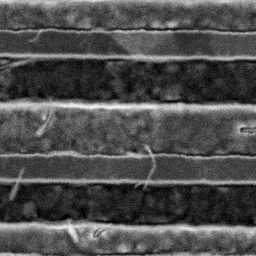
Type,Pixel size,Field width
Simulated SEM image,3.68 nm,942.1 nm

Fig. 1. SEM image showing lines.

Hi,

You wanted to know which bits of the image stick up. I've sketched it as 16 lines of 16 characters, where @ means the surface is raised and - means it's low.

@@@@@@@@@@@@@@@@
@@@@@@@@@@@@@@@@
@@@@@@@@@@@@@@@@
-----@@@@@@@@@@@
----------------
----------------
-@-@------------
@@@@@@@@@@@@@@@@
@@@@@@@@@@@@@@@@
@@@@@@@@@@@@@@@@
@@@@@@@@@@@@@@@@
----------------
----------------
----------------
@@@@@@@@@@@@@@@@
@@@@@@@@@@@@@@@@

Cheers